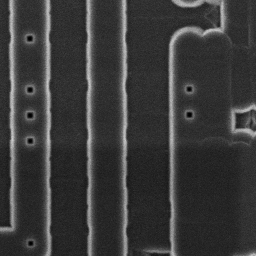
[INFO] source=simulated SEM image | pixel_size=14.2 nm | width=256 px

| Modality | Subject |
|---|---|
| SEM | wiring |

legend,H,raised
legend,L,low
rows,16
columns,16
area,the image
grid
LHHLLLHHLLLLLLHH
LHHLLLHHLLLLLLHH
LHHLLLHHLLLHHHHH
LHHLLLHHLLLHHHHH
LHHLLLHHLLLHHHHH
LHHLLLHHLLLHHHHH
LHHLLLHHLLLHHHHH
LHHLLLHHLLLHHHHL
LHHLLLHHLLLHHHHH
LHHLLLHHLLLHHHHH
LHHLLLHHLLLHHHHH
LHHLLLHHLLLHHHHH
LHHLLLHHLLLHHHHH
LHHLLLHHLLLHHHHH
HHHLLLHHLLLHHHHH
HHHLLLHHLLLHHHHH